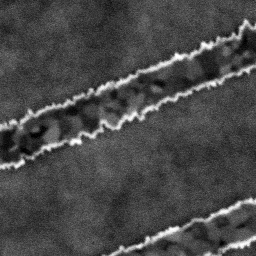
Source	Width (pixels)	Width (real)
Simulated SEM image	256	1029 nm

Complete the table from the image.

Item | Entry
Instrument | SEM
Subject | one or a few lines or trenches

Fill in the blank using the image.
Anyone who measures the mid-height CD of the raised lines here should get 151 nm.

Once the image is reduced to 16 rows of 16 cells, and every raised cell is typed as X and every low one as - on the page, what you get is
----------------
----------------
--------------XX
-----------XXXXX
---------XXXXXX-
------XXXXXX----
----XXXXXX------
-XXXXXXX--------
XXXXX-----------
XXX-------------
----------------
----------------
----------------
-------------XXX
----------XXXXXX
--------XXXXXX--